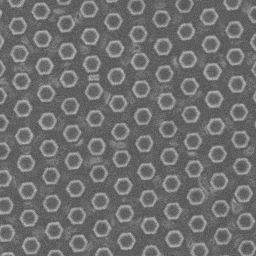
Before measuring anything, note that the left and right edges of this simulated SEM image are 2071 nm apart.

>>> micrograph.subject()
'a regular array of raised bodies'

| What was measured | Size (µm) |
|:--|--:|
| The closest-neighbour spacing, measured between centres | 0.22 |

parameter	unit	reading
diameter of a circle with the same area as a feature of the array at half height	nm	130